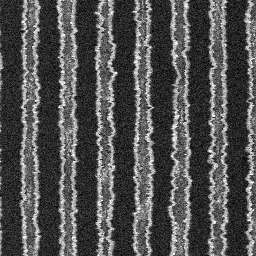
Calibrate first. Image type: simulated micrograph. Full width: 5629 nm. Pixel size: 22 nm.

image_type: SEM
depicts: parallel lines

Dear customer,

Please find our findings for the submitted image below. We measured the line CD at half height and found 558 nanometres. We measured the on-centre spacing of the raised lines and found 828 nanometres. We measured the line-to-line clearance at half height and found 11.9 pixels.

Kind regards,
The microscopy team